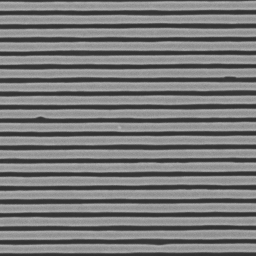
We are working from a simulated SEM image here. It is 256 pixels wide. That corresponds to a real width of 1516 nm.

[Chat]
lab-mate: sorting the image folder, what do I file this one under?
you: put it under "parallel lines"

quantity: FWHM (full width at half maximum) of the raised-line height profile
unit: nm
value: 56.3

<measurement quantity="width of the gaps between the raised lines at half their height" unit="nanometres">25.9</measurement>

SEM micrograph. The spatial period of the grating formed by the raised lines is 79.8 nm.